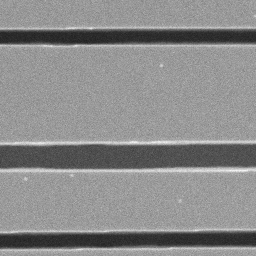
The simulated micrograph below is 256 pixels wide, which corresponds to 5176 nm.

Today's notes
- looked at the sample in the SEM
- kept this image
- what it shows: lines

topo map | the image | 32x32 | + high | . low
++++++++++++++++++++++++++++++++
++++++++++++++++++++++++++++++++
++++++++++++++++++++++++++++++++
++++++++++++....................
................................
................................
++++++++++++++++++++++++++++++++
++++++++++++++++++++++++++++++++
++++++++++++++++++++++++++++++++
++++++++++++++++++++++++++++++++
++++++++++++++++++++++++++++++++
++++++++++++++++++++++++++++++++
++++++++++++++++++++++++++++++++
++++++++++++++++++++++++++++++++
++++++++++++++++++++++++++++++++
++++++++++++++++++++++++++++++++
++++++++++++++++++++++++++++++++
++++++++++++++++++++++++++++++++
................................
................................
................................
++++++++++++++++++++++++++++++++
++++++++++++++++++++++++++++++++
++++++++++++++++++++++++++++++++
++++++++++++++++++++++++++++++++
++++++++++++++++++++++++++++++++
++++++++++++++++++++++++++++++++
++++++++++++++++++++++++++++++++
++++++++++++++++++++++++++++++++
................................
................................
++++++++++++++++++++++++++++++++